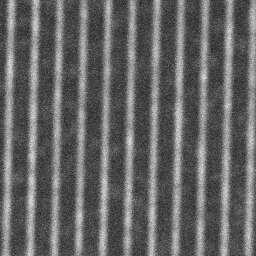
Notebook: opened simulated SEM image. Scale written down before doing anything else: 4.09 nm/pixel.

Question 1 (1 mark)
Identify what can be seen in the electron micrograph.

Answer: parallel lines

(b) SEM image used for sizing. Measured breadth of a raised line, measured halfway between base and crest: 18.4 nm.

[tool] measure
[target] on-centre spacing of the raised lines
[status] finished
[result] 99.2 nm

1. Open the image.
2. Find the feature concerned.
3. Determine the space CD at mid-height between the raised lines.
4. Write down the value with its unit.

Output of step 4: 0.0803 micrometres